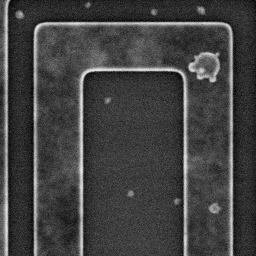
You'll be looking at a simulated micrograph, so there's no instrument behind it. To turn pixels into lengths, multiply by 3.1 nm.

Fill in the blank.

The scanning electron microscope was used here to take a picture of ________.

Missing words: groups of lines, slits or small figures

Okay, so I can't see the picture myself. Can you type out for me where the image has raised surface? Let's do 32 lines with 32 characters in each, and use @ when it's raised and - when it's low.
@-------------------------------
@-------------------------------
@-------------------------------
@---@@@@@@@@@@@@@@@@@@@@@@@@@---
@---@@@@@@@@@@@@@@@@@@@@@@@@@---
@---@@@@@@@@@@@@@@@@@@@@@@@@@---
@---@@@@@@@@@@@@@@@@@@@@@@@@@---
@---@@@@@@@@@@@@@@@@@@@@@@@@@---
@---@@@@@@@@@@@@@@@@@@@@@@@@@---
@---@@@@@@@------------@@@@@@---
@---@@@@@@-------------@@@@@@---
@---@@@@@@-------------@@@@@@---
@---@@@@@@-------------@@@@@@---
@---@@@@@@-------------@@@@@@---
@---@@@@@@-------------@@@@@@---
@---@@@@@@-------------@@@@@@---
@---@@@@@@-------------@@@@@@---
@---@@@@@@-------------@@@@@@---
@---@@@@@@-------------@@@@@@---
@---@@@@@@-------------@@@@@@---
@---@@@@@@-------------@@@@@@---
@---@@@@@@-------------@@@@@@---
@---@@@@@@-------------@@@@@@---
@---@@@@@@-------------@@@@@@---
@---@@@@@@-------------@@@@@@---
@---@@@@@@-------------@@@@@@---
@---@@@@@@-------------@@@@@@---
@---@@@@@@-------------@@@@@@---
@---@@@@@@-------------@@@@@@---
@---@@@@@@-------------@@@@@@---
@---@@@@@@-------------@@@@@@---
@---@@@@@@-------------@@@@@@---